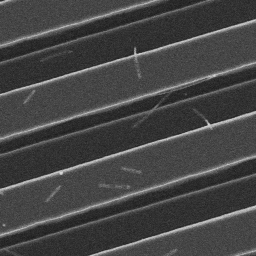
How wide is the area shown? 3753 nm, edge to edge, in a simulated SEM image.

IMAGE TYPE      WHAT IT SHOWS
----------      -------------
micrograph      lines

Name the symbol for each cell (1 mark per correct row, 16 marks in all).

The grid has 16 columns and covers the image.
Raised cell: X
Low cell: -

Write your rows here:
XXXXXXXX--------
XXXXX----------X
X-----------XXXX
--------XXXXXXXX
-----XXXXXXXXX--
-XXXXXXXXXX-----
XXXXXXX---------
XXXX----------XX
X----------XXXXX
--------XXXXXXXX
----XXXXXXXXXX--
-XXXXXXXXX------
XXXXXXX---------
XXXX----------XX
X---------XXXXXX
-------XXXXXXXXX